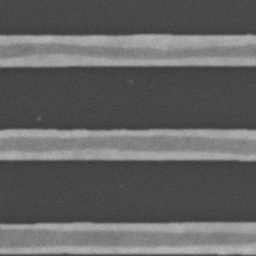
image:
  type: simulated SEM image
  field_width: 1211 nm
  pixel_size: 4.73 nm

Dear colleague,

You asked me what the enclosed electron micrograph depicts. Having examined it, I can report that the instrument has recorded lines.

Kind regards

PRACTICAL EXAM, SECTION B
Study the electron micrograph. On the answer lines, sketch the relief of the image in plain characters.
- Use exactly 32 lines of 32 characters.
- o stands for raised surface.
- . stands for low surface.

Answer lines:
................................
................................
................................
................................
................................
oooooooooooooooooooooooooooooooo
oooooooooooooooooooooooooooooooo
oooooooooooooooooooooooooooooooo
................................
................................
................................
................................
................................
................................
................................
................................
.o...........ooooooooooooo......
oooooooooooooooooooooooooooooooo
oooooooooooooooooooooooooooooooo
ooooooooo....ooooooooooooooooooo
................................
................................
................................
................................
................................
................................
................................
................................
oooooooooooooooooooooooooooooooo
oooooooooooooooooooooooooooooooo
oooooooooooooooooooooooooooooooo
................................